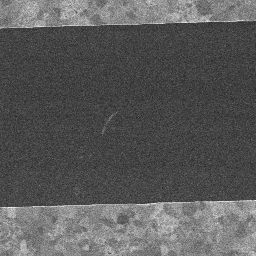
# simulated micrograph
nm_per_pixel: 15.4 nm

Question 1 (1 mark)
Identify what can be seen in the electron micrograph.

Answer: one or a few lines or trenches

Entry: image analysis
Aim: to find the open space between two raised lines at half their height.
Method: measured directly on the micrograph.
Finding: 2770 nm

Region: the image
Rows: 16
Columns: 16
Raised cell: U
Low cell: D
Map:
UUUUUUUUUUUUUUUU
UUUUUUUUUDDDDDDD
DDDDDDDDDDDDDDDD
DDDDDDDDDDDDDDDD
DDDDDDDDDDDDDDDD
DDDDDDDDDDDDDDDD
DDDDDDDDDDDDDDDD
DDDDDDDDDDDDDDDD
DDDDDDDDDDDDDDDD
DDDDDDDDDDDDDDDD
DDDDDDDDDDDDDDDD
DDDDDDDDDDDDDDDD
DDDDDDDDDDDDDDDD
UUUUUUUUUUUUUUUU
UUUUUUUUUUUUUUUU
UUUUUUUUUUUUUUUU